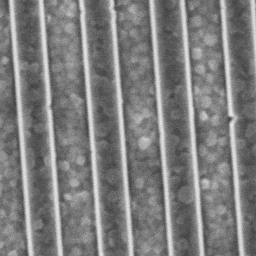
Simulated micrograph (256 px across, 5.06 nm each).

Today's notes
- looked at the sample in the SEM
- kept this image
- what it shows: one or a few lines or trenches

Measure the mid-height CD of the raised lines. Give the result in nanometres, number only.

168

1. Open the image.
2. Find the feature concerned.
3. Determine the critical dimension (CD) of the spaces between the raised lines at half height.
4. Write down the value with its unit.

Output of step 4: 187 nanometres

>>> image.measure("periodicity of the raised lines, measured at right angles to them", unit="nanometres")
356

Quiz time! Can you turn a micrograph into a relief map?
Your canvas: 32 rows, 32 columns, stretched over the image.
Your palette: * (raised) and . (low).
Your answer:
.****.....****.....****.....****
.****.....****.....****.....****
..***.....****.....****.....****
..***.....****.....****.....****
..****....****.....****.....****
..****....*****....****.....****
..****.....****....****.....****
..****.....****....*****....****
..****.....****....*****....****
..****.....****.....****....****
..****.....****.....****....****
..****.....****.....****.....***
..****.....****.....****.....***
..****.....****.....****.....***
..****.....****.....****.....***
...***.....****.....****.....***
...***.....****.....****.....***
...****....****.....****.....***
...****....*****....****.....***
...****.....****....****.....***
...****.....****....*****....***
...****.....****....*****....***
...****.....****.....****....***
...****.....****.....****....***
...****.....****.....****.....**
...****.....****.....****.....**
...****.....****.....****.....**
...****.....****.....****.....**
....***.....****.....****.....**
....***.....****.....****.....**
....****....****.....****.....**
....****....****.....****.....**